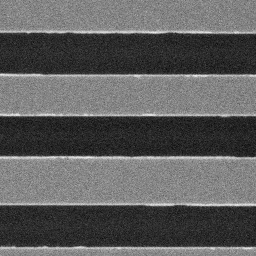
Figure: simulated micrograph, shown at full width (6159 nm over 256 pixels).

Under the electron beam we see lines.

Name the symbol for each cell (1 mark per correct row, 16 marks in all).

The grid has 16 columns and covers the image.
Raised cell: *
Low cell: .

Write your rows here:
****************
****************
................
................
................
****************
****************
................
................
................
****************
****************
****************
................
................
****************